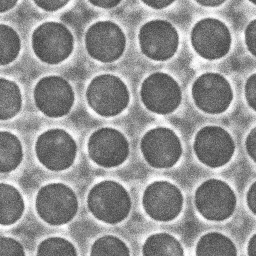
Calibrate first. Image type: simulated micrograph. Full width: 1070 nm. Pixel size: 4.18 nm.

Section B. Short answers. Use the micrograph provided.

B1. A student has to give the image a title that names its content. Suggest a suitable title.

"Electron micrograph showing a regular array of holes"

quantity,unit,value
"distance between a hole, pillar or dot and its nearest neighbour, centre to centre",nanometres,220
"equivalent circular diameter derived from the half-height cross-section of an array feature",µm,0.177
